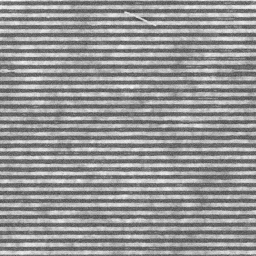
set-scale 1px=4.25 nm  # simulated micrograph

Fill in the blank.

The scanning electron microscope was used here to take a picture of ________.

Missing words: parallel lines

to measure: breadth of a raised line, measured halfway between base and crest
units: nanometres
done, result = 14.9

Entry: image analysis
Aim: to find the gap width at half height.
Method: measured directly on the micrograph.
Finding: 18.6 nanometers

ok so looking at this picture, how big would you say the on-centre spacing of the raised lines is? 33.6 nm